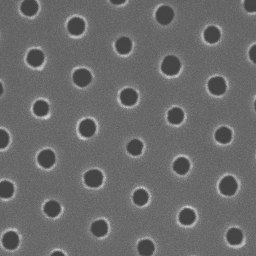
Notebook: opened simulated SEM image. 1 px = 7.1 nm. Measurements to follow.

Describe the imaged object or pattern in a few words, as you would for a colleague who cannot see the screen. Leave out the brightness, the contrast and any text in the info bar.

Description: a regular array of holes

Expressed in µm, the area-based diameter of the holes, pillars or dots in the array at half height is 0.129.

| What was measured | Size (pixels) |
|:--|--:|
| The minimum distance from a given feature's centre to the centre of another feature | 50.5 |